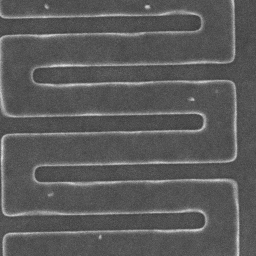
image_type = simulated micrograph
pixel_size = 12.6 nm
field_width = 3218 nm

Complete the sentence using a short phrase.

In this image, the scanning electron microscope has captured groups of lines, slits or small figures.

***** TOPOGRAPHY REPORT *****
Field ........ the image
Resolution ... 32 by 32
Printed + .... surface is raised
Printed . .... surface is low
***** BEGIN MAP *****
+++++++++++++++++++++++++++++...
+++++++++++++++++++++++++++++...
.........................++++...
.........................++++...
.++++.+++++++++++++++++++++++...
+++++++++++++++++++++++++++++...
+++++++++++++++++++++++++++++...
+++++++++++++++++++++++++++++...
+++++...........................
++++............................
+++++......++++++++++++++++++...
+++++++++++++++++++++++++++++...
+++++++++++++++++++++++++++++...
+++++++++++++++++++++++++++++...
.+++++++.................++++...
..........................+++...
.................++++++++++++...
+++++++++++++++++++++++++++++...
+++++++++++++++++++++++++++++...
+++++++++++++++++++++++++++++...
++++++++++++++..................
++++............................
+++++.................+++++++...
+++++++++++++++++++++++++++++...
++++++++++++++++++++++++++++++..
++++++++++++++++++++++++++++++..
+++++++++++++++++++++++..+++++..
..........................++++..
.........................+++++..
.+++++++++++++++++++++++++++++..
++++++++++++++++++++++++++++++..
++++++++++++++++++++++++++++++..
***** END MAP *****